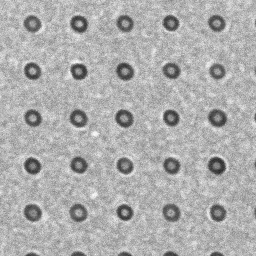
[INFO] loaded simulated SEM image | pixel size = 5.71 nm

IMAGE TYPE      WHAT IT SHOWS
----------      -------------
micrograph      a regular array of ring-shaped grooves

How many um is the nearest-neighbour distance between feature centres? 0.263